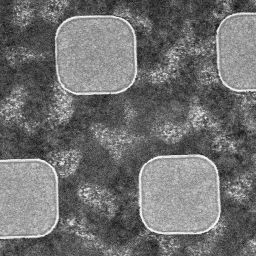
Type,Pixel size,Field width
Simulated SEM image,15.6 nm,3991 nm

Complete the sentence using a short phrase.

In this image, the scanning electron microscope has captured raised bodies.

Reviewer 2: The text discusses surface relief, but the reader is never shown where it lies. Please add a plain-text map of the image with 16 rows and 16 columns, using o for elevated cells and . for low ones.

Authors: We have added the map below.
................
....oooo......oo
....oooo......oo
....oooo......oo
....oooo......oo
....oooo......oo
................
................
................
................
ooo......oooo...
oooo.....ooooo..
oooo.....ooooo..
oooo.....ooooo..
ooo.......ooo...
................